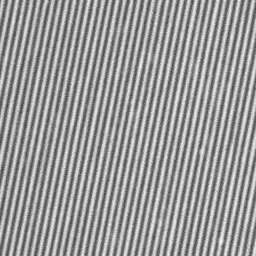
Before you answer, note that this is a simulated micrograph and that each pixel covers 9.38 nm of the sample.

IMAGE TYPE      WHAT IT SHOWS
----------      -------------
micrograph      parallel lines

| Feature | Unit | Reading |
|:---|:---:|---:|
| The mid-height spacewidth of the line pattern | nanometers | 43.8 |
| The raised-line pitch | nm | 65.9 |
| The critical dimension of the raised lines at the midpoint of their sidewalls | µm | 0.0265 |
